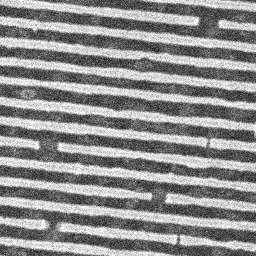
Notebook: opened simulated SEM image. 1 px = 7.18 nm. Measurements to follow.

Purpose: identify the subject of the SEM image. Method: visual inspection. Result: parallel lines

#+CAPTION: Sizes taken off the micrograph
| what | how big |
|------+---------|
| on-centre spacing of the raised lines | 143 nm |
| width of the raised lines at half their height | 0.0499 micrometres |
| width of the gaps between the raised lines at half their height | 13.2 pixels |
